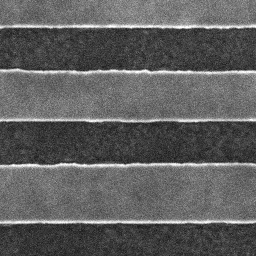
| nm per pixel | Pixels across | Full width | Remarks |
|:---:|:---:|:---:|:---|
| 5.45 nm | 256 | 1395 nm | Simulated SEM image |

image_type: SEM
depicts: lines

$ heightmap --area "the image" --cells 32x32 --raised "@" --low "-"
@@@@@@@@@@@@@@@@@@@@@@@@@@@@@@@@
@@@@@@@@@@@@@@@@@@@@@@@@@@@@@@@@
@@@@@@@@@@@@@@@@@@@@@@@@@@@@@@@@
--------------------------------
--------------------------------
--------------------------------
--------------------------------
--------------------------------
--------------------------------
@@@@@@@@@@@@@@@@@@@@@@@@@@@@@@@@
@@@@@@@@@@@@@@@@@@@@@@@@@@@@@@@@
@@@@@@@@@@@@@@@@@@@@@@@@@@@@@@@@
@@@@@@@@@@@@@@@@@@@@@@@@@@@@@@@@
@@@@@@@@@@@@@@@@@@@@@@@@@@@@@@@@
@@@@@@@@@@@@@@@@@@@@@@@@@@@@@@@@
--------------------------------
--------------------------------
--------------------------------
--------------------------------
--------------------------------
-------@@@------@@@@@@@@@@@@@@@@
@@@@@@@@@@@@@@@@@@@@@@@@@@@@@@@@
@@@@@@@@@@@@@@@@@@@@@@@@@@@@@@@@
@@@@@@@@@@@@@@@@@@@@@@@@@@@@@@@@
@@@@@@@@@@@@@@@@@@@@@@@@@@@@@@@@
@@@@@@@@@@@@@@@@@@@@@@@@@@@@@@@@
@@@@@@@@@@@@@@@@@@@@@@@@@@@@@@@@
@@@@@@@@@@@@@@@@@@@@@@@@@@@@@@@@
--------------------------------
--------------------------------
--------------------------------
--------------------------------